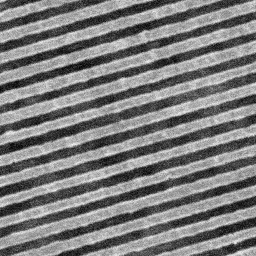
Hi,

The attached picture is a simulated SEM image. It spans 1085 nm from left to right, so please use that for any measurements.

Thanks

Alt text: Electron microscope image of parallel lines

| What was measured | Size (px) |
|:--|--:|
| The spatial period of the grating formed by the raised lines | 19.8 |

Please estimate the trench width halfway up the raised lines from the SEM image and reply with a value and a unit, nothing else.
45.4 nm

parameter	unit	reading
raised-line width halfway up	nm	37.7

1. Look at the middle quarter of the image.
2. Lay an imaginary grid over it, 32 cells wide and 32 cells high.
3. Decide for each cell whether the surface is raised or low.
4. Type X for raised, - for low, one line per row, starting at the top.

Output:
---------XXXXXXXX---------XXXXXX
------XXXXXXXX---------XXXXXXXXX
--XXXXXXXXX---------XXXXXXXX----
XXXXXXX---------XXXXXXXXX-------
XXX---------XXXXXXXXXX---------X
---------XXXXXXXXX----------XXXX
------XXXXXXXXX---------XXXXXXX-
---XXXXXXXX----------XXXXXXX----
XXXXXXXX---------XXXXXXXX-------
XXXX---------XXXXXXXX-----------
X----------XXXXXXX----------XXXX
-------XXXXXXX-----------XXXXXXX
----XXXXXXX----------XXXXXXXX---
XXXXXXX-----------XXXXXXXX------
XXXX----------XXXXXXXX----------
------------XXXXXXX---------XXXX
-------XXXXXXXX----------XXXXXXX
----XXXXXXXX----------XXXXXXXX--
XXXXXXXXX---------XXXXXXXXX-----
XXXXX----------XXXXXXXX---------
X----------XXXXXXXX-----------XX
--------XXXXXXXX-----------XXXXX
----XXXXXXXX-----------XXXXXXX--
-XXXXXXXX----------XXXXXXX------
XXXX------------XXXXXXX---------
XX----------XXXXXX-------------X
---------XXXXXXX----------XXXXXX
------XXXXXX-----------XXXXXXXX-
--XXXXXXXX---------XXXXXXX------
XXXXX-----------XXXXXXXX--------
XX-----------XXXXXXX----------XX
---------XXXXXXXX---------XXXXXX